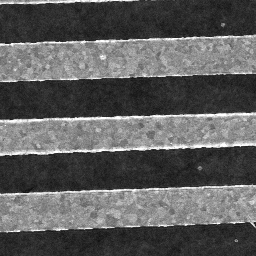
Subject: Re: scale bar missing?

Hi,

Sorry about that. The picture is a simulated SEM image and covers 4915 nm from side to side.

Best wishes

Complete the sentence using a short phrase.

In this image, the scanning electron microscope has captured lines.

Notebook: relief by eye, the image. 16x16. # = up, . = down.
................
................
........########
################
################
................
................
..##############
################
#####...........
................
................
################
################
................
................